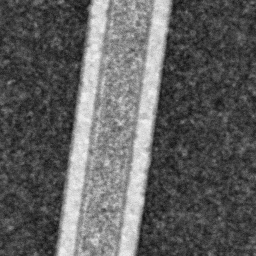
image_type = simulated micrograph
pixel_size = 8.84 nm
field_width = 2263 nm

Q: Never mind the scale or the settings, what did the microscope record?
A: one or a few lines or trenches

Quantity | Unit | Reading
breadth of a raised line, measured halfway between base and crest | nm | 525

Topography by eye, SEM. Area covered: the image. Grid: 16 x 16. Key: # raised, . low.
......####......
......####......
......####......
......####......
......###.......
......###.......
.....####.......
.....####.......
.....####.......
.....####.......
.....####.......
.....###........
.....###........
....####........
....####........
....####........